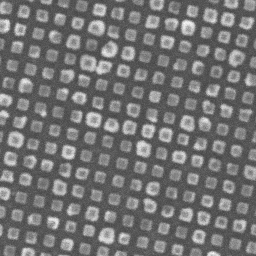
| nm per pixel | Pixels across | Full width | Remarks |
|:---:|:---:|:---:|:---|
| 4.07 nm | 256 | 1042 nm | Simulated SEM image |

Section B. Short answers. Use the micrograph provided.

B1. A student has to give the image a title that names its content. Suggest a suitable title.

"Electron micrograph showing a regular array of raised bodies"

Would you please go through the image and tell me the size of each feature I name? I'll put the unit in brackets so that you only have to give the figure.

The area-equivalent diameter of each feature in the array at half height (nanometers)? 47.2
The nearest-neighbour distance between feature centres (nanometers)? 72.3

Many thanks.